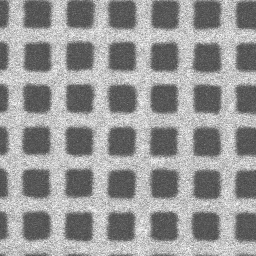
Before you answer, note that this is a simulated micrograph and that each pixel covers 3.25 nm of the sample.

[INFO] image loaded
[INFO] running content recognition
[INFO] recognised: a regular array of holes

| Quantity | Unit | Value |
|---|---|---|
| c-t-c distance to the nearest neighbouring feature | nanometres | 136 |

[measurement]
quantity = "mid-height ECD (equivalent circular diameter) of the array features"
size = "0.0981 um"